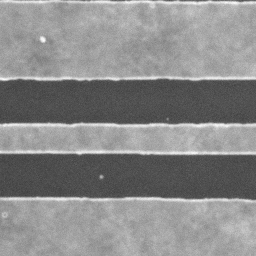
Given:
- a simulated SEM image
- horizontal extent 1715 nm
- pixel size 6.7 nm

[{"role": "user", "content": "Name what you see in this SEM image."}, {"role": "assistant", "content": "lines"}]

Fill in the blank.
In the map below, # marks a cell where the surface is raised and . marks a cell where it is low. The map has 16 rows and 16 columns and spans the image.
################
################
################
################
################
................
................
................
################
################
................
................
################
################
################
################